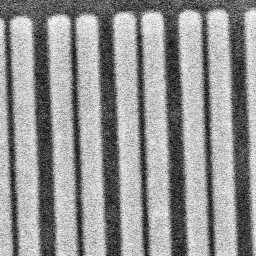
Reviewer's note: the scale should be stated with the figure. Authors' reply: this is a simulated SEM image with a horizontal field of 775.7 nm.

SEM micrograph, parallel lines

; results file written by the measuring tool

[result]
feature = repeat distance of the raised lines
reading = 99.1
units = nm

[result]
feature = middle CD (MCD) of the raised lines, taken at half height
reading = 61.7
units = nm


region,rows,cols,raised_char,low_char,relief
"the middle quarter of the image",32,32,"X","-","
XX--XXXX-----XXXXX--XXXXX----XXX
XX--XXXX-----XXXXX--XXXXX----XXX
XX--XXXX-----XXXXX--XXXXX----XXX
XX--XXXX-----XXXXX--XXXXX-----XX
XX--XXXXX----XXXXX--XXXXX-----XX
XX--XXXXX----XXXXX--XXXXX-----XX
XX--XXXXX----XXXXX--XXXXX-----XX
XX--XXXXX----XXXXX--XXXXX-----XX
XX--XXXXX----XXXXX--XXXXX-----XX
XX--XXXXX----XXXXX--XXXXX-----XX
XX--XXXXX----XXXXX--XXXXX-----XX
XX--XXXXX----XXXXX--XXXXX-----XX
XX--XXXXX----XXXXX--XXXXX-----XX
XX--XXXXX----XXXXX--XXXXX-----XX
XX--XXXXX----XXXXX--XXXXXX----XX
XX--XXXXX-----XXXX--XXXXXX----XX
XX--XXXXX-----XXXX--XXXXXX----XX
XX--XXXXX-----XXXX---XXXXX----XX
XX--XXXXX-----XXXXX--XXXXX----XX
XX--XXXXX-----XXXXX--XXXXX----XX
XX--XXXXX-----XXXXX--XXXX-----XX
XX--XXXXX-----XXXXX--XXXXX----XX
XX--XXXXX-----XXXXX--XXXXX----XX
XX--XXXXX-----XXXXX--XXXXX----XX
XX--XXXXX-----XXXXX--XXXXX----XX
XX--XXXXX-----XXXXX--XXXXX-----X
XX--XXXXX-----XXXXX--XXXXX----XX
XX--XXXXX-----XXXXX--XXXXX----XX
XX--XXXXX-----XXXXX--XXXXX----XX
XX---XXXX-----XXXXX--XXXXX----XX
XX---XXXX-----XXXXX--XXXXX----XX
XXX--XXXX-----XXXXX--XXXXX----XX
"